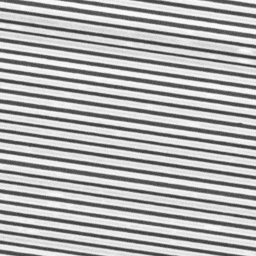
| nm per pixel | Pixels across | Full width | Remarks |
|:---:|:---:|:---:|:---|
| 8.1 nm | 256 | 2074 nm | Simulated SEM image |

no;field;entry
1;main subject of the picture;parallel lines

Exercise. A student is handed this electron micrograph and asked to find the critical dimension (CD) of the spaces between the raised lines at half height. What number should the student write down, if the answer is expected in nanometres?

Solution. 41.1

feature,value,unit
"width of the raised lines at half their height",41.1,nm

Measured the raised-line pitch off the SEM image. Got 81 nm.